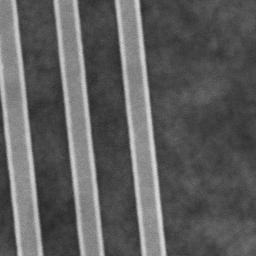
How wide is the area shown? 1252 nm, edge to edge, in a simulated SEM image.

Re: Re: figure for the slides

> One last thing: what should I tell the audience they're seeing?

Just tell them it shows one or a few lines or trenches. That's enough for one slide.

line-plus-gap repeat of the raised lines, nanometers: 300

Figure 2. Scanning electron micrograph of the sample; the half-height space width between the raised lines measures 201 nm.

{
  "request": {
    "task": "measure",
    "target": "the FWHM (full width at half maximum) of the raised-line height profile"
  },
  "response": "0.1 um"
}